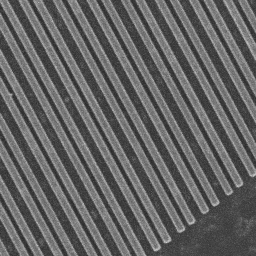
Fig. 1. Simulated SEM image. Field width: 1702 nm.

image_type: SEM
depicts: parallel lines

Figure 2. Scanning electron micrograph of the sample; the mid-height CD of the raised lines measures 44.6 nm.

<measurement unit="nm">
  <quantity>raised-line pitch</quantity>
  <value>99.6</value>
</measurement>